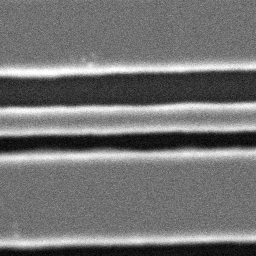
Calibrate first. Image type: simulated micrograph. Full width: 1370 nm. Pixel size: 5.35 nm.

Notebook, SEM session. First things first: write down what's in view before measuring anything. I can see lines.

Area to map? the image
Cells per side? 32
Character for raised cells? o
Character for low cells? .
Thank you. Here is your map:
oooooooooooooooooooooooooooooooo
oooooooooooooooooooooooooooooooo
oooooooooooooooooooooooooooooooo
oooooooooooooooooooooooooooooooo
oooooooooooooooooooooooooooooooo
oooooooooooooooooooooooooooooooo
oooooooooooooooooooooooooooooooo
oooooooooooooooooooooooooooooooo
ooooooooooooooooooooooooooooo...
................................
................................
................................
................................
...................ooooooooooooo
oooooooooooooooooooooooooooooooo
oooooooooooooooooooooooooooooooo
ooooooooooooooo.................
................................
................................
...ooooooooooooooooooooooooooooo
oooooooooooooooooooooooooooooooo
oooooooooooooooooooooooooooooooo
oooooooooooooooooooooooooooooooo
oooooooooooooooooooooooooooooooo
oooooooooooooooooooooooooooooooo
oooooooooooooooooooooooooooooooo
oooooooooooooooooooooooooooooooo
oooooooooooooooooooooooooooooooo
oooooooooooooooooooooooooooooooo
oooooooooooooooooooooooooooooooo
oooooo..........................
................................